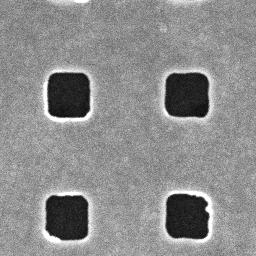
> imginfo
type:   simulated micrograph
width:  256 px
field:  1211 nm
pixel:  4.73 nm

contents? holes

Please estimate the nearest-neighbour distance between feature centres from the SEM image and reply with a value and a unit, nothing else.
563 nm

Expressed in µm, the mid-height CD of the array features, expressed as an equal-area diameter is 0.228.